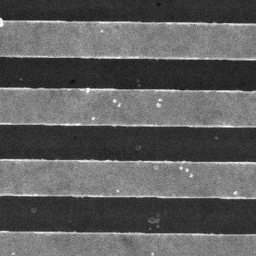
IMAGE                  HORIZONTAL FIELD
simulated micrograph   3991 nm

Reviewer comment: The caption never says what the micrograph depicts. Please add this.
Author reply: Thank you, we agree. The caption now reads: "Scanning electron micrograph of lines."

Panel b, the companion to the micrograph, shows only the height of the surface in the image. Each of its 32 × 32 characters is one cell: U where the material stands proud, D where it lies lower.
DDDDDDDDDDDDDDDDDDDDDDDDDDDDDDDD
DDDDDDDDDDDDDDDDDDDDDDDDDDDDDDDD
DDDDDDDDDDDDDDDDDDDDDDDDDDDDDDDD
UUUUUUUUUUUUUUUUUUUUUUUUUUUUUUUU
UUUUUUUUUUUUUUUUUUUUUUUUUUUUUUUU
UUUUUUUUUUUUUUUUUUUUUUUUUUUUUUUU
UUUUUUUUUUUUUUUUUUUUUUUUUUUUUUUU
DDDDDDDDDDDDDDDDDDDDDDDDDDDDDDDD
DDDDDDDDDDDDDDDDDDDDDDDDDDDDDDDD
DDDDDDDDDDDDDDDDDDDDDDDDDDDDDDDD
DDDDDDDDDDDDDDDDDDDDDDDDDDDDDDDD
UUUUUUUUUUUUUUUUUUUUUUUUUUUUUUUU
UUUUUUUUUUUUUUUUUUUUUUUUUUUUUUUU
UUUUUUUUUUUUUUUUUUUUUUUUUUUUUUUU
UUUUUUUUUUUUUUUUUUUUUUUUUUUUUUUU
DDDDDDUUUUUUUUUUUUUUUUUUUUUUUUUU
DDDDDDDDDDDDDDDDDDDDDDDDDDDDDDDD
DDDDDDDDDDDDDDDDDDDDDDDDDDDDDDDD
DDDDDDDDDDDDDDDDDDDDDDDDDDDDDDDD
DDDDDDDDDDDDDDDDDDDDDDDDDDDDDDDD
UUUUUUUUUUUUUUUUUUUUUUUUUUUUUUUU
UUUUUUUUUUUUUUUUUUUUUUUUUUUUUUUU
UUUUUUUUUUUUUUUUUUUUUUUUUUUUUUUU
UUUUUUUUUUUUUUUUUUUUUUUUUUUUUUUU
DDDDDDDDDDUUUUUUUUUUUUUUUUUUUUUU
DDDDDDDDDDDDDDDDDDDDDDDDDDDDDDDD
DDDDDDDDDDDDDDDDDDDDDDDDDDDDDDDD
DDDDDDDDDDDDDDDDDDDDDDDDDDDDDDDD
DDDDDDDDDDDDDDDDDDDDDDDDDDDDDDDD
UUUUUUUUUUUUUUUUUUUUUUUUUUUUUUUU
UUUUUUUUUUUUUUUUUUUUUUUUUUUUUUUU
UUUUUUUUUUUUUUUUUUUUUUUUUUUUUUUU